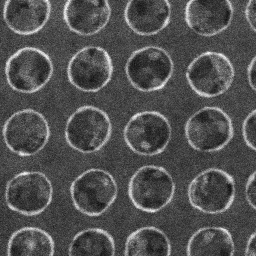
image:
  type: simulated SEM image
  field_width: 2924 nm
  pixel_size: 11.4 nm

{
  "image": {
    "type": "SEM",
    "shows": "a regular array of raised bodies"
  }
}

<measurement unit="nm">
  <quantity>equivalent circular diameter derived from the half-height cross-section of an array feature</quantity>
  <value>502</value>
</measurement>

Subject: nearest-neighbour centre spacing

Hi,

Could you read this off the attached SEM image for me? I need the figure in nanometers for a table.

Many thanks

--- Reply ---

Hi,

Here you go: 668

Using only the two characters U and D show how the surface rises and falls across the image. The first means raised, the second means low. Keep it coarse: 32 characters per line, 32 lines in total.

DUUUUUDDUUUUUDDDUUUUUDDDUUUUUDDU
DUUUUUDDUUUUUUDDUUUUUDDDUUUUUDDU
DUUUUUDDUUUUUDDDUUUUUDDDUUUUUDDU
DUUUUDDDDUUUUDDDDUUUDDDDUUUUDDDD
DDDDDDDDDDDDDDDDDDDDDDDDDDDDDDDD
DDDDDDDDDDDDDDDDDDDDDDDDDDDDDDDD
DDDUUDDDDDUUUDDDDUUUUDDDDDDDDDDD
DUUUUUDDDUUUUUDDUUUUUDDDUUUUDDDD
DUUUUUDDDUUUUUDDUUUUUDDDUUUUUDDU
DUUUUUDDDUUUUUDDUUUUUDDUUUUUUDDU
DUUUUDDDDUUUUDDDDUUUUDDDUUUUUDDU
DDDDDDDDDDDDDDDDDDDDDDDDDUUUDDDD
DDDDDDDDDDDDDDDDDDDDDDDDDDDDDDDD
DDDDDDDDDDDDDDDDDDDDDDDDDDDDDDDD
DUUUUDDDDUUUUDDDDUUUDDDDUUUUDDDU
DUUUUUDDUUUUUUDDUUUUUDDUUUUUUDDU
DUUUUUDDUUUUUUDDUUUUUDDUUUUUUDDU
DUUUUUDDDUUUUDDDUUUUUDDDUUUUDDDU
DUUUUDDDDUUUDDDDDUUUDDDDUUUDDDDD
DDDDDDDDDDDDDDDDDDDDDDDDDDDDDDDD
DDDDDDDDDDDDDDDDDDDDDDDDDDDDDDDD
DDDDDDDDDDDUUDDDDUUUUDDDDDUUDDDD
DDUUUUDDDUUUUUDDDUUUUDDDUUUUUDDU
DUUUUUDDDUUUUUDDUUUUUUDDUUUUUDDU
DUUUUUDDDUUUUUDDUUUUUDDDUUUUUDDU
DUUUUUDDDUUUUUDDDUUUUDDDUUUUUDDU
DDDUUDDDDDUUUDDDDDDDDDDDDDUDDDDD
DDDDDDDDDDDDDDDDDDDDDDDDDDDDDDDD
DDDDDDDDDDDDDDDDDDDDDDDDDDDDDDDD
DDUUUUDDDDUUUDDDUUUUUDDDUUUUUDDD
DUUUUUUDDUUUUUDDUUUUUDDDUUUUUDDU
DUUUUUUDDUUUUUDDUUUUUDDDUUUUUDDU